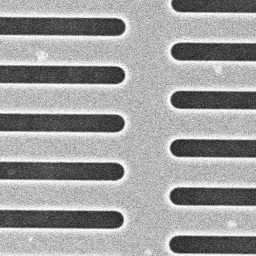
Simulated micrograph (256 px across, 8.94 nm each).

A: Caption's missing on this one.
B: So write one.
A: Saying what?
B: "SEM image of groups of lines, slits or small figures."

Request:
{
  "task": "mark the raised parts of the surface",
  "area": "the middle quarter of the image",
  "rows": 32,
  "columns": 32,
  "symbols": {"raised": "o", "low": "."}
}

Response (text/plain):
.............ooooooooooooooooooo
...............ooooooooooooooooo
...............ooooooooooooooooo
...............ooooooooooooooooo
...............ooooooooooooooooo
oooooooooooooooooooooooooooooooo
oooooooooooooooooooooooooooooooo
ooooooooooooooooooooooooooo.....
oooooooooooooooooooooooooo......
oooooooooooooooooooooooooo......
ooooooooooooooooooooooooooo.....
oooooooooooooooooooooooooooooooo
....oooooooooooooooooooooooooooo
...............ooooooooooooooooo
...............ooooooooooooooooo
...............ooooooooooooooooo
...............ooooooooooooooooo
oooooooooooooooooooooooooooooooo
oooooooooooooooooooooooooooooooo
ooooooooooooooooooooooooooo.....
oooooooooooooooooooooooooo......
oooooooooooooooooooooooooo......
ooooooooooooooooooooooooooo.....
oooooooooooooooooooooooooooooo..
.............ooooooooooooooooooo
...............ooooooooooooooooo
...............ooooooooooooooooo
...............ooooooooooooooooo
..............oooooooooooooooooo
oooooooooooooooooooooooooooooooo
oooooooooooooooooooooooooooooooo
ooooooooooooooooooooooooooo.....